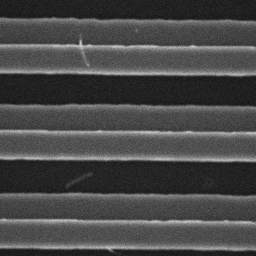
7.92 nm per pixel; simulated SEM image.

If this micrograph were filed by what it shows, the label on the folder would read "lines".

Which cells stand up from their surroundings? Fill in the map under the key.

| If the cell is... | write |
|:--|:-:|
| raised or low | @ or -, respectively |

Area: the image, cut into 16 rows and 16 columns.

----------------
@@@@@@@@@@@@@@@@
@@@@@@@@@@@@@@@@
@@@@@@@@@@@@@@@@
@@@@@@@@@@@@@@@@
----------------
----------------
@@@@@@@@@@@@@@@@
@@@@@@@@@@@@@@@@
@@@@@@@@@@@@@@@@
----------------
----------------
@@@@@@@@@@@@@@@@
@@@@@@@@@@@@@@@@
@@@@@@@@@@@@@@@@
--@@@@@@@@@@@@@@